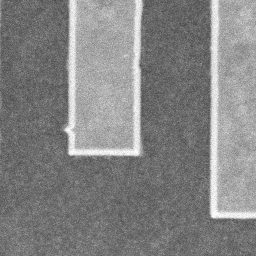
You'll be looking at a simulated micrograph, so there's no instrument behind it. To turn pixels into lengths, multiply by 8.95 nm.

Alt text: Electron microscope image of one or a few lines or trenches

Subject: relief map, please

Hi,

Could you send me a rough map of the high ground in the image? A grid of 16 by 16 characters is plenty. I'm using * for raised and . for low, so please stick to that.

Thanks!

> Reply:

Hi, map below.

....*****....***
....*****....***
....*****....***
....*****....***
....*****....***
....*****....***
....*****....***
....*****....***
....*****....***
.....***.....***
.............***
.............***
.............***
................
................
................